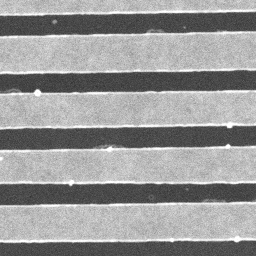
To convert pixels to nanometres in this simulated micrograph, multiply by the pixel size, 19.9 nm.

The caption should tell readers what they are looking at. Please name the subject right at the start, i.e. lines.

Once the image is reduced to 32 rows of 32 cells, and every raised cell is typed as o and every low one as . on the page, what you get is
oooooooooooooooooooooooooooooooo
ooooooooooooooooooooooooooo.....
................................
................................
......oooooooooooooooooooooooooo
oooooooooooooooooooooooooooooooo
oooooooooooooooooooooooooooooooo
oooooooooooooooooooooooooooooooo
oooooooooooooooooooooooooooooooo
................................
................................
....o.............oooooooooooooo
oooooooooooooooooooooooooooooooo
oooooooooooooooooooooooooooooooo
oooooooooooooooooooooooooooooooo
oooooooooooooooooooooooooooooooo
................................
................................
..........................oooooo
oooooooooooooooooooooooooooooooo
oooooooooooooooooooooooooooooooo
oooooooooooooooooooooooooooooooo
oooooooooooooooooooooooooooooooo
................................
................................
...................ooooooooooooo
oooooooooooooooooooooooooooooooo
oooooooooooooooooooooooooooooooo
oooooooooooooooooooooooooooooooo
oooooooooooooooooooooooooooooooo
................................
................................